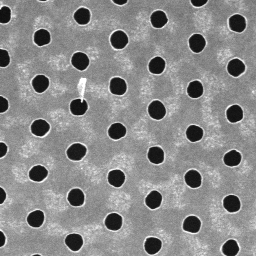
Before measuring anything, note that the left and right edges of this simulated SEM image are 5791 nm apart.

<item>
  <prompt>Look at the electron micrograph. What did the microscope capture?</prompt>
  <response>a regular array of holes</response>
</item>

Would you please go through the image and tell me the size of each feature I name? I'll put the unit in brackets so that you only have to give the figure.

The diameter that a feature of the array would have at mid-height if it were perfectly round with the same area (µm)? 0.402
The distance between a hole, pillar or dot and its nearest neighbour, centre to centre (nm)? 998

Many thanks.